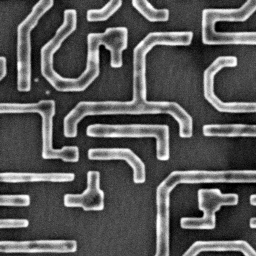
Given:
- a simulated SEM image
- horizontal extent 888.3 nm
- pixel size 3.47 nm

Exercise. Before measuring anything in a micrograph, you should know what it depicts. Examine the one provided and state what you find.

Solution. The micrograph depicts wiring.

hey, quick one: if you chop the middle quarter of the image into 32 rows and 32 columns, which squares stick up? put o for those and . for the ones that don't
......ooo...oo....oo............
......ooo.........oo............
.....oooo.........oo............
....oooo..........oo............
ooooooo...........oo............
oooooo............oo............
oooo..............oo............
..................oo............
.................ooo............
..........ooo...ooooo...........
...oooooooooooooooooooooooooo...
..oooooooooooooooooooooooooooo..
.ooooooo...................oooo.
ooooo.......................oooo
oooo.........................ooo
ooo...oooooooooooooooooooo...ooo
ooo...oooooooooooooooooooo...ooo
ooo...oooooooooooooooooooo...ooo
.......................ooo......
.......................ooo......
.......................ooo......
ooo...oooooooooo.......ooo......
oooo..oooooooooooo.....ooo......
oooo..ooooooooooooo....ooo......
................ooo.............
.................ooo............
..................oo............
......ooo.........oo.......ooooo
oo....ooo.........oo......oooooo
......ooo.........oo.....ooooooo
......ooo...............oooo....
......ooo..............oooo.....